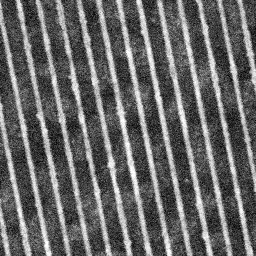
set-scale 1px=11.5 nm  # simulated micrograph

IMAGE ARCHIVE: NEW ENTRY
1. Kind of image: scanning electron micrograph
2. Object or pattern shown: parallel lines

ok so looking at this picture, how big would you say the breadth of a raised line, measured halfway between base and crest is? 43.6 nanometers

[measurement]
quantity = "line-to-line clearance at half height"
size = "0.184 microns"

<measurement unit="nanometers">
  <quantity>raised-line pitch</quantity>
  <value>227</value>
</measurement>